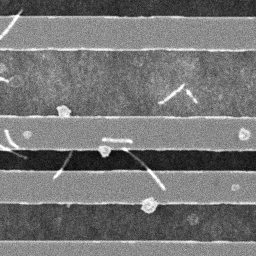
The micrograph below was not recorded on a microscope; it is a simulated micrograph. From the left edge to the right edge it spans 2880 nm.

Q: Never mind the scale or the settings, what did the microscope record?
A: lines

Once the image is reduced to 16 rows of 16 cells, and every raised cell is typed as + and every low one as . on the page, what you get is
................
++++++++++++++++
++++++++++++++++
................
................
................
................
++++++++++++++++
++++++++++++++++
......+.........
................
++++++++++++++++
++++++++++++++++
................
................
++++++++++++++++